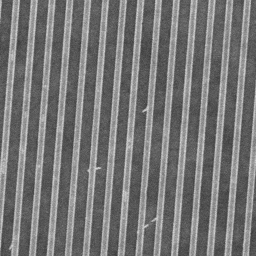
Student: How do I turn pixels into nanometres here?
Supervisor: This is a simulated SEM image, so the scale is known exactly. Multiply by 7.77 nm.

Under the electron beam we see parallel lines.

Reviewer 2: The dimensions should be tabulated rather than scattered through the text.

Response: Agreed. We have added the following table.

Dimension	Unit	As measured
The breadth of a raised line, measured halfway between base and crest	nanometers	39.7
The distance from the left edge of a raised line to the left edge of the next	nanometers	138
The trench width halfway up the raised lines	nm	97.9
